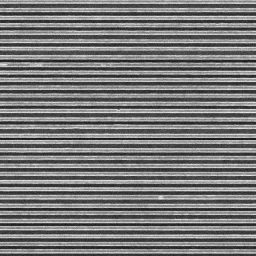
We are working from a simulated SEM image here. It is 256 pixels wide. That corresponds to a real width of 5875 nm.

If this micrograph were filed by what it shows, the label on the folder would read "parallel lines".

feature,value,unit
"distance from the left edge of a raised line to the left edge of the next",179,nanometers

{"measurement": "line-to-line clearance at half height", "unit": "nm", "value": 100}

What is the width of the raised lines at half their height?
83.2 nanometres